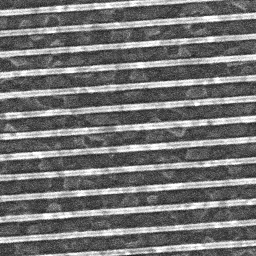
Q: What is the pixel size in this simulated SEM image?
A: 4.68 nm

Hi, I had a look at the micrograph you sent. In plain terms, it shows parallel lines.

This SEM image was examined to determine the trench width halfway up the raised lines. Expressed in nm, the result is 75.8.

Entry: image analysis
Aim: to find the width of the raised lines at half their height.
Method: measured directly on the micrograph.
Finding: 0.021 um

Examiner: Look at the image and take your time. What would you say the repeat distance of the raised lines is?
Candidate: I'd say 96.4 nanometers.